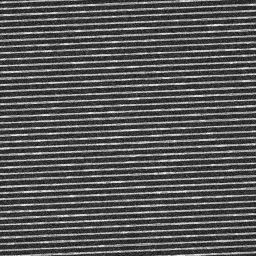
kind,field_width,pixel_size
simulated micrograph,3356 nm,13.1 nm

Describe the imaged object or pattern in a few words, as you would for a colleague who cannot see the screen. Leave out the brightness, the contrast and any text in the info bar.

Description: parallel lines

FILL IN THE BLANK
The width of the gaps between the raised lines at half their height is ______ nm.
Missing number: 65.5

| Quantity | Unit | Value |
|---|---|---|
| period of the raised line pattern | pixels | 6.35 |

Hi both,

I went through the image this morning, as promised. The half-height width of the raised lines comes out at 18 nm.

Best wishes